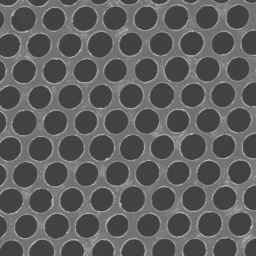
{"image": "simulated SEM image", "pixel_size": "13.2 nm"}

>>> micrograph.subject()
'a regular array of holes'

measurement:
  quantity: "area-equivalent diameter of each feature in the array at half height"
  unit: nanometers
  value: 313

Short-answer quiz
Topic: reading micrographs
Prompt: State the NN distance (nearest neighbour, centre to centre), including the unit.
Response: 0.396 um